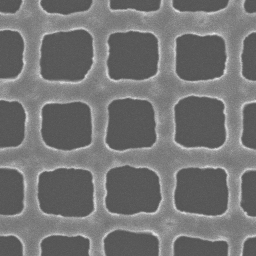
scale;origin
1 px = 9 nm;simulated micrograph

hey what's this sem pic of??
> a regular array of holes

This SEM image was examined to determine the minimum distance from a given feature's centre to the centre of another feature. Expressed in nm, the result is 592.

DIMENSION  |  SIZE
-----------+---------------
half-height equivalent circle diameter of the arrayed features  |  54.8 px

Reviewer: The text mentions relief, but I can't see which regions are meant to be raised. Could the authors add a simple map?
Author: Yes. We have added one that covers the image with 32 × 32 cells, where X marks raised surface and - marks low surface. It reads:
---XX------XXX------XX------XX--
--XXXX----XXXXXXXXXXXXXXXXXXXXX-
XXXXXXXXXXXXXXXXXXXXXXXXXXXXXXXX
XXXXXXXXXXXXXXXXXXXXXXXXXXXXXXXX
---XXX-----XXX-----XXX-----XXXX-
---XX-------X-------XX------XX--
---XX-------XX------XX------XX--
---XX-------X-------XX------XX--
---XX------XX-------XX------XX--
--XXX------XXX-----XXX------XX--
XXXXXXXXXXXXXXXXXXXXXXXXXXXXXXXX
XXXXXXXXXXXXXXXXXXXXXXXXXXXXXXXX
XXXXXXXXXXXXXXX---XXXXX----XXXXX
---XX------XX------XXX------XX--
---XX------XXX-----XXX------XX--
---XX------XXX-----XXX------XX--
---XX------XX------XXX------XX--
---XX------XX-------XX------XX--
XXXXXXX---XXXX-----XXXX-XX-XXXX-
XXXXXXXXXXXXXXXXXXXXXXXXXXXXXXXX
XXXXXXXXXXXXXXXXXXXXXXXXXXXXXXXX
--XXX------XXX-----XXX------XXX-
---XX-------X-------XX------XX--
---XX-------X-------XX-------X--
---XX-------X-------XX-------X--
---XX-------X-------XX-------X--
---XX-------XX-----XXXX-----XXX-
XXXXXXXXXXXXXXXXXXXXXXXXXXXXXXXX
XXXXXXXXXXXXXXXXXXXXXXXXXXXXXXXX
X-XXXX--X-XXX------XXXXXXXXXXXXX
---XX------XX-------XX------XX--
---XX------XX-------XX-------X--